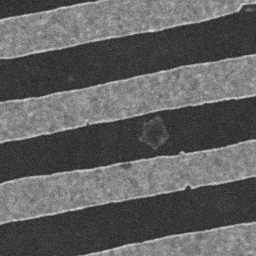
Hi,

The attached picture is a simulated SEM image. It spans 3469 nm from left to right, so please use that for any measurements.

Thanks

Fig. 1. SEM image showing one or a few lines or trenches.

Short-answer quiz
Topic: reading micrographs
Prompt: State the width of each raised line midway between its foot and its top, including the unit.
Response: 508 nanometres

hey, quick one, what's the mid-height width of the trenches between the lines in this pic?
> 0.6 µm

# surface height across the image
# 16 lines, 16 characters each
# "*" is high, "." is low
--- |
....***********.
************....
******..........
*..............*
..........******
......**********
************....
*******.........
**.......*......
............****
......**********
*************...
********........
***.............
............****
.......*********